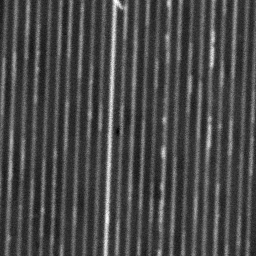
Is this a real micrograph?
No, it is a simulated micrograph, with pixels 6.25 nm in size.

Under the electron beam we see parallel lines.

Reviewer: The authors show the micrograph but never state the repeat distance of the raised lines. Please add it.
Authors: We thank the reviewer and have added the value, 0.0683 microns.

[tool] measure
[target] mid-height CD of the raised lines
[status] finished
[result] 0.0172 µm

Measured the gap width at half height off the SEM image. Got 53.9 nanometers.